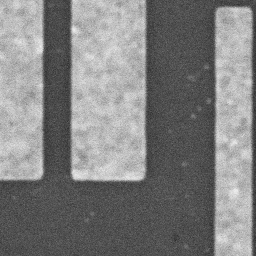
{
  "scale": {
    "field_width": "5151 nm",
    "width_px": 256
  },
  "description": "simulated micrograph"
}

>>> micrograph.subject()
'wiring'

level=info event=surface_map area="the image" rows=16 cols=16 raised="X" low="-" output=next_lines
XXX--XXXX-----X-
XXX--XXXX-----XX
XXX--XXXX-----XX
XXX--XXXX-----XX
XXX--XXXX-----XX
XXX--XXXX-----XX
XXX--XXXX-----XX
XXX--XXXX-----XX
XXX--XXXX-----XX
XXX--XXXX-----XX
XXX--XXXX-----XX
--------------XX
--------------XX
--------------XX
--------------XX
--------------XX